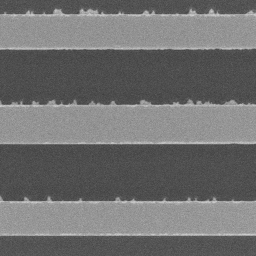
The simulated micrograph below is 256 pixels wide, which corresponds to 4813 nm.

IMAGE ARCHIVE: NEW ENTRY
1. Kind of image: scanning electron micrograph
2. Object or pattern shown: lines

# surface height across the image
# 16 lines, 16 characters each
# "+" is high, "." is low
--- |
................
++++++++++++++++
++++++++++++++++
................
................
................
................
++++++++++++++++
++++++++++++++++
................
................
................
................
++++++++++++++++
++++++++++++++++
................